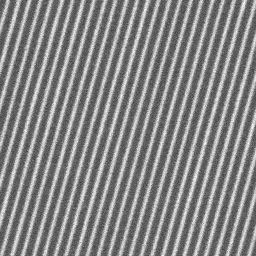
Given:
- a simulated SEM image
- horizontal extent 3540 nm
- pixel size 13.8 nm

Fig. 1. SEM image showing parallel lines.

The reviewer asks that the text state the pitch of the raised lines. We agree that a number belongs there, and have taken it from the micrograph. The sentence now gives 0.143 micrometres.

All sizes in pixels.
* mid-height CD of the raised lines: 2.53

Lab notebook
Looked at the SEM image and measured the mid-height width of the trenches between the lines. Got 0.105 micrometres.